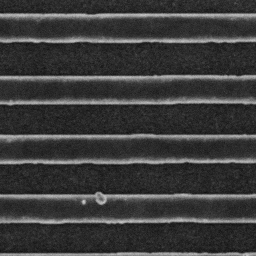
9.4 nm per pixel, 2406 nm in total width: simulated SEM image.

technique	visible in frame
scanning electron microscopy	lines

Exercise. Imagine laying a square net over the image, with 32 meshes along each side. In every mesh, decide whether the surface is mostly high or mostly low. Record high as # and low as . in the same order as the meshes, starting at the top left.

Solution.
................................
................................
################################
################################
################################
................................
................................
................................
................................
.......................###......
################################
################################
################################
................................
................................
................................
................................
################################
################################
################################
................................
................................
................................
................................
#####....######..###############
################################
################################
################################
................................
................................
................................
................................